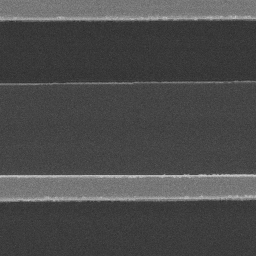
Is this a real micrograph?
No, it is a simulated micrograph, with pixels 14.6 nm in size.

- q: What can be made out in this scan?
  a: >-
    lines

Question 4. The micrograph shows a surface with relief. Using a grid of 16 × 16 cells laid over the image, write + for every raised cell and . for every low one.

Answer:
++++++++++++++++
................
................
................
................
++++++++++++++++
++++++++++++++++
++++++++++++++++
++++++++++++++++
++++++++++++++++
++++++++++++++++
++++++++++++++++
+++++...........
................
................
................